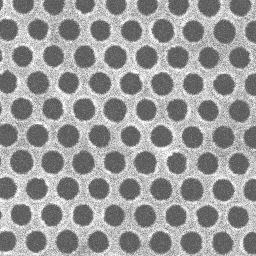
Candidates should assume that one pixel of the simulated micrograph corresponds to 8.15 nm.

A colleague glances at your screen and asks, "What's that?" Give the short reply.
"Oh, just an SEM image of a regular array of holes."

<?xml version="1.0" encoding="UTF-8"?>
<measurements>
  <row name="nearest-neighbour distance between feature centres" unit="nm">248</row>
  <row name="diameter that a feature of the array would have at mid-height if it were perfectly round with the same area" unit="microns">0.187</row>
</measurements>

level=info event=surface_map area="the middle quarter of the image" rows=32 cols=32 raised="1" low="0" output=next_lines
11100001111000011110000111000001
11111111111111111111111111111111
00011110000111100001111000111110
00001100000011000001110000011100
00001100000011000000110000011100
00001100000011000000110000011100
00011110000111000001110000011100
00111111001111110011111000111110
11111011111101111111111111111111
11100001110000011110000111000011
11000000110000001100000111000001
11000000110000001100000111000001
11000000110000001100000111000001
11100001111000011110000111000011
11111111111100111111111111110111
00011110001111110011111000111111
00001100000111100001110000011100
00001100000011000001100000011000
00001100000011000001100000011000
00001110000111000001110000011100
00011111000111110011110000111100
11111111111111111111111111111111
11100001111000111100001111100011
11000001110000011100000111000001
11000000110000001000000111000001
11000000110000001000000111000001
11100001111000011100000111000011
11110011111101111110001111100111
00111111011111110111111001111110
00011100000111000001110000011100
00001100000011000001100000011000
00001100000011000001100000011000